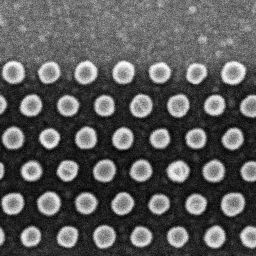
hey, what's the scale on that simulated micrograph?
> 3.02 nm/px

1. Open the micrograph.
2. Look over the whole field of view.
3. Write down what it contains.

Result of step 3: a regular array of raised bodies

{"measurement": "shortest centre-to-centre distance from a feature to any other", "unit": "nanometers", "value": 110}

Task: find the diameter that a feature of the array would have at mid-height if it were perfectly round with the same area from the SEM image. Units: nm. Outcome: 62.3